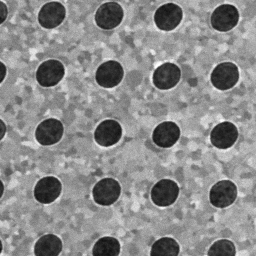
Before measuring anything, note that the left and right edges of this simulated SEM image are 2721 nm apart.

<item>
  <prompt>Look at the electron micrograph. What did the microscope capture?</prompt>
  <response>a regular array of holes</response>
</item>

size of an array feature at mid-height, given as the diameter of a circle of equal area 306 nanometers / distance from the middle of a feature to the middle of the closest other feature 614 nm